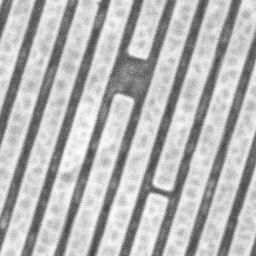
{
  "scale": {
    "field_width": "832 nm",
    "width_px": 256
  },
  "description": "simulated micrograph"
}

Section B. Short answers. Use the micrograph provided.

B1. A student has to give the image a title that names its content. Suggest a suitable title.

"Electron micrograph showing parallel lines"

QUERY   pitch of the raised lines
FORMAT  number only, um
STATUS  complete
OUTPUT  0.101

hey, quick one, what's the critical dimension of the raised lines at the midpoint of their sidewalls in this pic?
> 60.2 nanometers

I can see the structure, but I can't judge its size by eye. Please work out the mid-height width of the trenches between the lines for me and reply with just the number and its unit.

41.6 nanometers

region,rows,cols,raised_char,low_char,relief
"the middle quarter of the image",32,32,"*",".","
****...*****............****...*
***....*****...........*****...*
***....****............****....*
***...*****............****....*
**....*****...........*****...**
**....****............*****...**
**...*****............****....**
**...*****...........*****...***
*....****....***.....*****...***
*...*****....****....****....***
*...*****...*****...*****...****
....*****...****....*****...****
...*****....****....****....****
...*****...*****...*****...*****
...*****...*****...*****...*****
..*****....****....****....*****
..*****...*****...*****...*****.
..*****...*****...*****...*****.
..****....****....****....*****.
.*****...*****....****....****..
.*****...*****...*****...*****..
*****....****....*****...*****..
*****...*****....****....****...
*****...*****...*****...*****...
****....****....*****...*****...
****...*****....****....****....
****...*****...*****...*****....
****...****....*****...*****...*
***...*****....****....*****...*
***...*****...*****...*****....*
***...*****...*****....****...**
**....****....****............**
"